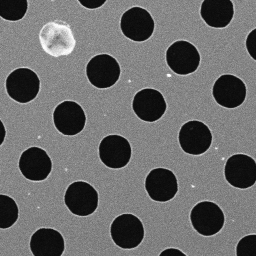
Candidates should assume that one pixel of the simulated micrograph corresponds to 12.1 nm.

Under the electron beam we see a regular array of holes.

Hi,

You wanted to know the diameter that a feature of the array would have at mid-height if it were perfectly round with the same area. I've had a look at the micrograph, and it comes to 409 nm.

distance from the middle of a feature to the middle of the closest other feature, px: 56.6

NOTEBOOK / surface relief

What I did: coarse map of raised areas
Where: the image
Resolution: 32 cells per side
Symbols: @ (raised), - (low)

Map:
---@@@@@@@---@@@@@@@@@@@@----@@@
---@@@@@@@@@@@@@--@@@@@@@----@@@
@-@@@@@@@@@@@@@----@@@@@@@---@@@
@@@@@@@@@@@@@@@----@@@@@@@@@@@@@
@@@@@@@@@@@@@@@@---@@@@@@@@@@@@-
@@@@@@@@@@@@@@@@@@@@@@--@@@@@@@-
@@@@@@@@@@@@@@@@@@@@@----@@@@@@-
@@@@@@@@@@@---@@@@@@@----@@@@@@@
@@@@@@@@@@@----@@@@@@----@@@@@@@
@----@@@@@@----@@@@@@@@@@@@@-@@@
@----@@@@@@@--@@@@@@@@@@@@@---@@
@----@@@@@@@@@@@@---@@@@@@@----@
@@--@@@@@@@@@@@@@----@@@@@@----@
@@@@@@@---@@@@@@@----@@@@@@@@@@@
@@@@@@@----@@@@@@---@@@@@@@@@@@@
@@@@@@@----@@@@@@@@@@@@--@@@@@@@
-@@@@@@@--@@@@@@@@@@@@----@@@@@@
@@@@@@@@@@@@@---@@@@@@----@@@@@@
@@@@-@@@@@@@----@@@@@@@---@@@@@@
@@@---@@@@@@----@@@@@@@@@@@@@--@
@@----@@@@@@@---@@@@@@@@@@@@----
@@@---@@@@@@@@@@@@@--@@@@@@@----
@@@@-@@@@@@@@@@@@@----@@@@@@----
@@@@@@@@----@@@@@@----@@@@@@@@-@
-@@@@@@@----@@@@@@@---@@@@@@@@@@
--@@@@@@----@@@@@@@@@@@@@--@@@@@
--@@@@@@@---@@@@@@@@@@@@----@@@@
--@@@@@@@@@@@@---@@@@@@@----@@@@
-@@@@@@@@@@@@@----@@@@@@----@@@@
@@@@----@@@@@@----@@@@@@@@@@@@@-
@@@@----@@@@@@@--@@@@@@@@@@@@@--
@@@@----@@@@@@@@@@@@---@@@@@@@--